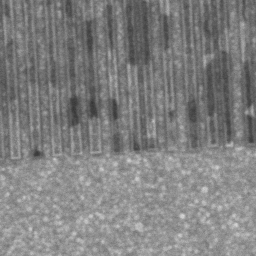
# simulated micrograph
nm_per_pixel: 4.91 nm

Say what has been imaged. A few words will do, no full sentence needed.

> parallel lines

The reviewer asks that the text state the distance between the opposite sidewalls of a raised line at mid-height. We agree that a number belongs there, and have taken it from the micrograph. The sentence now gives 43.5 nm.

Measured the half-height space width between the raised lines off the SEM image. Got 54.6 nanometers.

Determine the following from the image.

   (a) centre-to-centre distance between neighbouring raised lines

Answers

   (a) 0.0967 micrometres